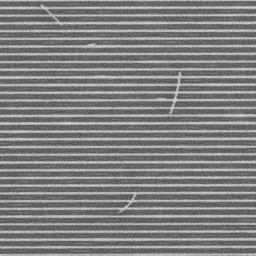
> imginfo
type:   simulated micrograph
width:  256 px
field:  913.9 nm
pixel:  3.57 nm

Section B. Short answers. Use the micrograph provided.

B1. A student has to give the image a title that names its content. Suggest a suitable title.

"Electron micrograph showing parallel lines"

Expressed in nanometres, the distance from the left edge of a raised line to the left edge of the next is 27.5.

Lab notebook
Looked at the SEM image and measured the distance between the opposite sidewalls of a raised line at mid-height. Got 6.7 nm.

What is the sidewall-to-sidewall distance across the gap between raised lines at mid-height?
20.1 nm